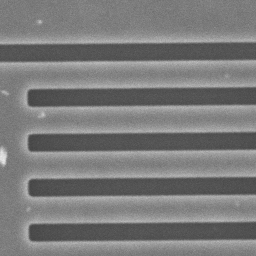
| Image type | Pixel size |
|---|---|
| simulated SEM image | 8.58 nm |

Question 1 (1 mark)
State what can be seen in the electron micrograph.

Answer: groups of lines, slits or small figures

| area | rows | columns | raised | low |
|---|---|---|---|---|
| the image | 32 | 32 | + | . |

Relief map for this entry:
++++++++++++++++++++++++++++++++
++++++++++++++++++++++++++++++++
++++++++++++++++++++++++++++++++
++++++++++++++++++++++++++++++++
++++++++++++++++++++++++++++++++
................................
................................
................................
++++++++++++++++++++++++++++++++
++++++++++++++++++++++++++++++++
++++++++++++++++++++++++++++++++
++++............................
+++.............................
++++++++++++++++++++++++++++++++
++++++++++++++++++++++++++++++++
++++++++++++++++++++++++++++++++
++++++++++++++++................
+++.............................
++++............................
++++++++++++++++++++++++++++++++
++++++++++++++++++++++++++++++++
++++++++++++++++++++++++++++++++
++++............................
+++.............................
++++.................+++++++++++
++++++++++++++++++++++++++++++++
++++++++++++++++++++++++++++++++
++++++++++++++++++++++++++++++++
++++............................
+++.............................
++++++++++++++++++++++++++++++++
++++++++++++++++++++++++++++++++